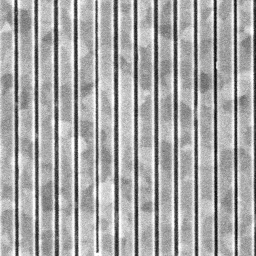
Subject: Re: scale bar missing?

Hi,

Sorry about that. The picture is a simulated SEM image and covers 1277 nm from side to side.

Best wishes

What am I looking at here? parallel lines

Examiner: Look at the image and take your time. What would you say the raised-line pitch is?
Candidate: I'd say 99.3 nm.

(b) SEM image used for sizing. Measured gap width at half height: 4.51 pixels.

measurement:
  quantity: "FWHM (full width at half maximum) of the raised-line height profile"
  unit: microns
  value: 0.0774